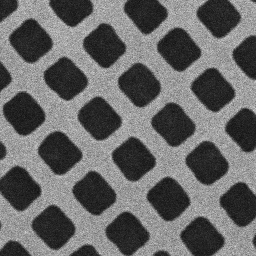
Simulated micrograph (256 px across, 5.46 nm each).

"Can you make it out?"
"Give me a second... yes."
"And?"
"a regular array of holes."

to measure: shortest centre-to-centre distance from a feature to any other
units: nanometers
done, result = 285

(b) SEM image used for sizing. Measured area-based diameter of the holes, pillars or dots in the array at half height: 220 nm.